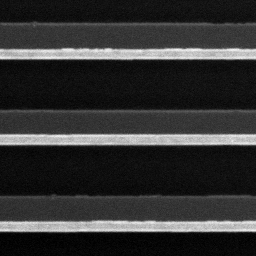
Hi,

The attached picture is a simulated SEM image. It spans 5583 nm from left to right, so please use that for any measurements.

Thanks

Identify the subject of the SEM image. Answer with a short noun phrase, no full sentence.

lines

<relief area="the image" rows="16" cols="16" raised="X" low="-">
----------------
XXX-------X-----
XXXXXXXXXXXXXXXX
XXXXXXXXXXXXXXXX
----------------
----------------
----------------
XXXXXXXXXXXXXXXX
XXXXXXXXXXXXXXXX
----------------
----------------
----------------
XXXXXXXXXXXXXXXX
XXXXXXXXXXXXXXXX
----------------
----------------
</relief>